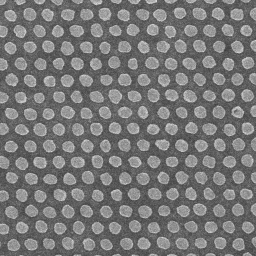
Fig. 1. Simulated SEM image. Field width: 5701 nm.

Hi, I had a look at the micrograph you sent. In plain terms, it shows a regular array of raised bodies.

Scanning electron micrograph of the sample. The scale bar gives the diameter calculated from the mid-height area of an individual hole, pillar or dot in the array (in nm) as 262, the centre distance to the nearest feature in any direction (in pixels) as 17.9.